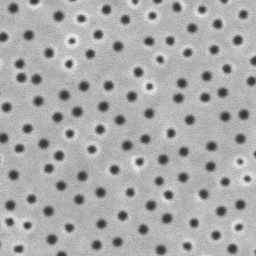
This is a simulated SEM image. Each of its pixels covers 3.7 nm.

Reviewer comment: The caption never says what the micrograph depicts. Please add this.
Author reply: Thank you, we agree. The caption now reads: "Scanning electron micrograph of a regular array of holes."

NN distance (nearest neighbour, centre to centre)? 78.1 nm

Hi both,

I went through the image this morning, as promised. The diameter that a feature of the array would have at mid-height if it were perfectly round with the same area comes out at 39.6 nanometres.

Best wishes